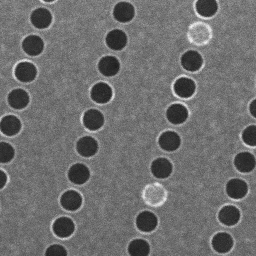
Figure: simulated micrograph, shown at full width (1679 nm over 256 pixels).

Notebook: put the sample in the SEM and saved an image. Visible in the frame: a regular array of holes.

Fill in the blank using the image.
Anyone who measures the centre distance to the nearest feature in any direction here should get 182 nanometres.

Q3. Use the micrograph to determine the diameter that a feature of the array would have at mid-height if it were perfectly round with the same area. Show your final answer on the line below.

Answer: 0.147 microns